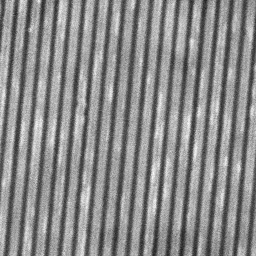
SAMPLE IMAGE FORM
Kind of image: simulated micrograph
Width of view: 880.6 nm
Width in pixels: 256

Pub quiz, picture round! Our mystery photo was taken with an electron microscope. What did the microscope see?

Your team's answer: parallel lines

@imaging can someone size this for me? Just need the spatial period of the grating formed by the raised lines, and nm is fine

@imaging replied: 46.1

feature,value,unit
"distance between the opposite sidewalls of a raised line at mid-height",24.8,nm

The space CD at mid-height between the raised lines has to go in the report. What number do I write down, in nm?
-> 21.8